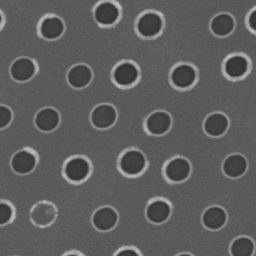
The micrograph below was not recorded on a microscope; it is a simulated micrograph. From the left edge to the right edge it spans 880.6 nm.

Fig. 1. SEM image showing a regular array of holes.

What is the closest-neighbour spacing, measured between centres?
161 nanometers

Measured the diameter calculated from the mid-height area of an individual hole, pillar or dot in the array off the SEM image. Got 0.0833 micrometres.